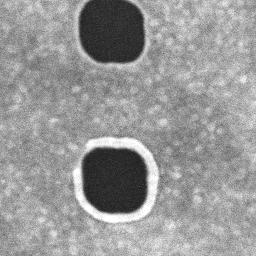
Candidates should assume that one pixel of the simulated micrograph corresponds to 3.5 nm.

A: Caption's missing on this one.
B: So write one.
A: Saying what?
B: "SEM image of holes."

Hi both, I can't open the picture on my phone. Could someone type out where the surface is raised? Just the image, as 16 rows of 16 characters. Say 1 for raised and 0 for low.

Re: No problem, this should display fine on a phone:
1111100001111111
1111100001111111
1111100001111111
1111110001111111
1111111111111111
1111111111111111
1111111111111111
1111111111111111
1111111111111111
1111110001111111
1111100001111111
1111100001111111
1111100001111111
1111111111111111
1111111111111111
1111111111111111